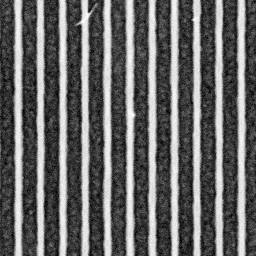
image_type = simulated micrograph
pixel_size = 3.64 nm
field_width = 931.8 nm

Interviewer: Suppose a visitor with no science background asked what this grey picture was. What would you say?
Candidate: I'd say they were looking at parallel lines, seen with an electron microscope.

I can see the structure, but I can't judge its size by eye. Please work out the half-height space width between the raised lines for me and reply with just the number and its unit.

59.6 nanometres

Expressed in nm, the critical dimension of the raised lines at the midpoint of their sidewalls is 20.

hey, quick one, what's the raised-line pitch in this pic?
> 81.3 nm